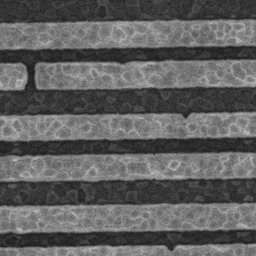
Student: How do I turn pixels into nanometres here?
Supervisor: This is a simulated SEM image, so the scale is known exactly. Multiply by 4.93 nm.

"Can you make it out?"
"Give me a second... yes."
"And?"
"parallel lines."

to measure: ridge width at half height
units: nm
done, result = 129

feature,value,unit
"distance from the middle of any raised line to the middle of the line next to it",45.8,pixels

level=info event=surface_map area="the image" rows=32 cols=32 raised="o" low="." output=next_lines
................................
................................
...............................o
oooooooooooooooooooooooooooooooo
oooooooooooooooooooooooooooooooo
oooooooooooooooooooooooooooooooo
................................
................................
ooo.oooooooooooooooooooooooooooo
ooo.oooooooooooooooooooooooooooo
ooo.oooooooooooooooooooooooooooo
................................
................................
................................
ooooooooooooooooooooooo.oooooooo
oooooooooooooooooooooooooooooooo
oooooooooooooooooooooooooooooooo
oooo.oo.........................
................................
.....ooooooooooooooooooooooooooo
oooooooooooooooooooooooooooooooo
oooooooooooooooooooooooooooooooo
ooooooo...ooo...................
................................
................................
....................o.....oooooo
oooooooooooooooooooooooooooooooo
oooooooooooooooooooooooooooooooo
oooooooooooooooooooooooooooooooo
................................
...............................o
oooooooooooooooooooooooooooooooo